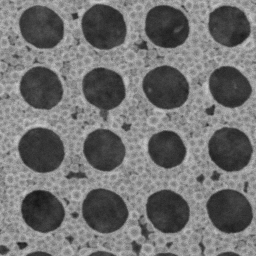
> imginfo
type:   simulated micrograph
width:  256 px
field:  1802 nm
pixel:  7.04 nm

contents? a regular array of holes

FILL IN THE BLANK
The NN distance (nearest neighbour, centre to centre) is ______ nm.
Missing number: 430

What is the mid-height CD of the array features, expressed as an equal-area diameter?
313 nm